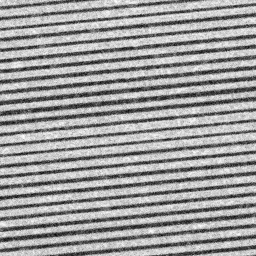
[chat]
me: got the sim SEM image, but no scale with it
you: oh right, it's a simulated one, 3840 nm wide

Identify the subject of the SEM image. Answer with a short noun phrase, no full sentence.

parallel lines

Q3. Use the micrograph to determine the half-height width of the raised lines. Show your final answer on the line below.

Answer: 0.0895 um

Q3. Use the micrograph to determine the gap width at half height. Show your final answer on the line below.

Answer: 0.0671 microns